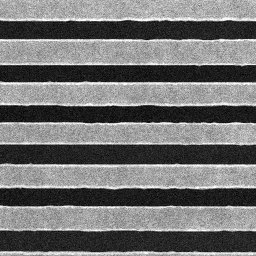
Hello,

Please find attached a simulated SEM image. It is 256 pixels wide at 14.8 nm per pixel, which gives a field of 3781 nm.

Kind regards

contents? lines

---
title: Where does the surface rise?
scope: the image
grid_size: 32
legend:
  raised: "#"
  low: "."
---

################################
################################
################################
................................
................................
################################
################################
################################
................................
................................
################################
################################
################################
................................
................................
################################
################################
################################
................................
................................
................................
################################
################################
.............###.##.#######.....
................................
................................
################################
################################
################################
................................
................................
###########..##.####.#..#.......